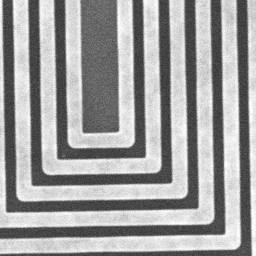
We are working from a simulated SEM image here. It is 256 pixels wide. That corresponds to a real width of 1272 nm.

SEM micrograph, groups of lines, slits or small figures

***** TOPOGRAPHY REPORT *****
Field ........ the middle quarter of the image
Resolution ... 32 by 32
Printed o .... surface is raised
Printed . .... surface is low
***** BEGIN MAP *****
.ooo..........ooo...oooo...ooo..
.ooo..........ooo...oooo...ooo..
.ooo..........ooo...oooo...ooo..
.ooo..........ooo...oooo...ooo..
.ooo..........ooo...oooo...ooo..
.ooo..........ooo...oooo...ooo..
.ooo..........ooo...oooo...ooo..
.ooo..........ooo...oooo...ooo..
.ooo..........ooo...oooo...ooo..
.ooo..........ooo...oooo...ooo..
.ooo..........ooo...oooo...ooo..
.ooo..........ooo...oooo...ooo..
.ooo..........ooo...oooo...ooo..
.ooo..........ooo...oooo...oooo.
.ooo..........ooo...oooo...oooo.
.ooo..........ooo....ooo...oooo.
.ooo..........ooo....ooo...oooo.
.oooo.....ooooooo....ooo...oooo.
.oooooooooooooooo....ooo...oooo.
.oooooooooooooooo....ooo...oooo.
..oooooooooooooo.....ooo...oooo.
.....................ooo...oooo.
.....................ooo...oooo.
....................oooo...oooo.
oooooooooooooooooooooooo...oooo.
oooooooooooooooooooooooo...oooo.
oooooooooooooooooooooooo...oooo.
ooooo......................oooo.
...........................oooo.
...........................oooo.
ooooooooooooooooooooooooooooooo.
ooooooooooooooooooooooooooooooo.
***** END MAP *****